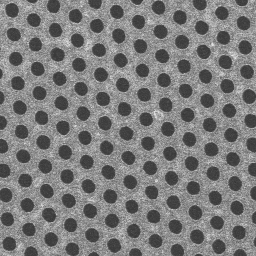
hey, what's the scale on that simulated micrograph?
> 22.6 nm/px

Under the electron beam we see a regular array of holes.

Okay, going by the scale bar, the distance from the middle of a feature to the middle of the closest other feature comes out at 539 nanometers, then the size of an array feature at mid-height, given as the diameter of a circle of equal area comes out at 0.32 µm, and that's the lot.